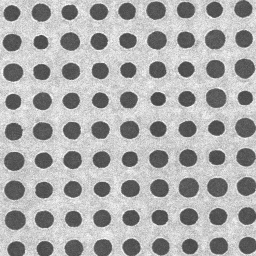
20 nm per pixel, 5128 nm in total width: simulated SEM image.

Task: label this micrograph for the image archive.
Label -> a regular array of holes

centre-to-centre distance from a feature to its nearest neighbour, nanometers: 578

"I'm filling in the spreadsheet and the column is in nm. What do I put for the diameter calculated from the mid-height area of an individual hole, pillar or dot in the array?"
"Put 359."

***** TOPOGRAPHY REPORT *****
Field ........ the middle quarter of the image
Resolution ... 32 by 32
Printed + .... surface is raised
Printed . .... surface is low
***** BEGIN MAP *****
....+++....+++....+++....++++...
....+++....+++....+++.....++....
....+++....+++....+++.....+++...
...+++++..++++++.+++++..++++++++
++++++++++++++++++++++++++++++++
++++++++++++++++++++++++++++++++
++++++++++++++++++++++++++++++++
+..+++++..+++++...++++...++++...
....+++....+++.....++....++++...
....+++....+++....++++...++++...
....+++....++++...+++++.++++++..
++++++++++++++++++++++++++++++++
++++++++++++++++++++++++++++++++
++++++++++++++++++++++++++++++++
+..+++++..+++++...++++...+++++..
....+++....+++.....+++....+++...
....+++....+++.....++.....++....
....+++....+++.....+++...++++...
+..+++++..+++++...++++++++++++++
++++++++++++++++++++++++++++++++
++++++++++++++++++++++++++++++++
+++++++++++++++++++++++..+++++..
+...++++...++++...++++....+++...
....+++.....++.....++.....+++...
....+++.....++....+++.....+++...
....++++...++++..+++++...+++++..
++++++++++++++++++++++++++++++++
++++++++++++++++++++++++++++++++
++++++++++++++++++++++++++++++..
+..++++++.+++++...++++....+++...
....++++...+++.....+++....+++...
.....++.....++.....+++....+++...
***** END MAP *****